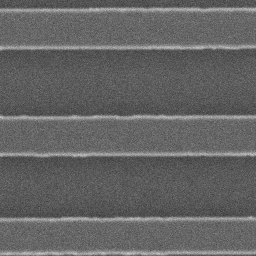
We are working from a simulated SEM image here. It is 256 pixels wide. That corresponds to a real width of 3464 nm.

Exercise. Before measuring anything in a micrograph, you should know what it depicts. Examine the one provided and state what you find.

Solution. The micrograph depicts lines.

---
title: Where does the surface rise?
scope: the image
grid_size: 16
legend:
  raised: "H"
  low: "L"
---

LLLLLLLLLLLLLLLH
HHHHHHHHHHHHHHHH
HHHHHHHHHHHHHHHH
LLLLLLLLLLLLLLLL
LLLLLLLLLLLLLLLL
LLLLLLLLLLLLLLLL
LLLLLLLLLLLLLLLL
HHHHHHHHHHHHHHHH
HHHHHHHHHHHHHHHH
HHHHHHHHHHHHHHHH
LLLLLLLLLLLLLLLL
LLLLLLLLLLLLLLLL
LLLLLLLLLLLLLLLL
LLLLLLLLLLLLLLLL
HHHHHHHHHHHHHHHH
HHHHHHHHHHHHHHHH